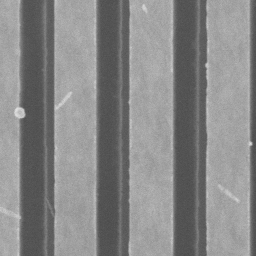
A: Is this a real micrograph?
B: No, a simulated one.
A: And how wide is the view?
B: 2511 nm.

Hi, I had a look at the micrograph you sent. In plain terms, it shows lines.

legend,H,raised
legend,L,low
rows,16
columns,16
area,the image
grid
HLLHHHLLHHHLLHHH
HLLHHHLLHHHLLHHH
HLLHHHLLHHHLLHHH
HLLHHHLLHHHLLHHH
HLLHHHLLHHHLLHHH
HLLHHHLLHHHLLHHH
HLLHHHLLHHHLLHHH
HLLHHHLLHHHLLHHH
HLLHHHLLHHHLLHHH
HLLHHHLLHHHLLHHH
HLLHHHLLHHHLLHHH
HLLHHHLLHHHLLHHH
HLLHHHLLHHHLLHHH
HLLHHHLLHHHLLHHH
HLLHHHLLHHHLLHHH
HLLHHHLLHHHLLHHH